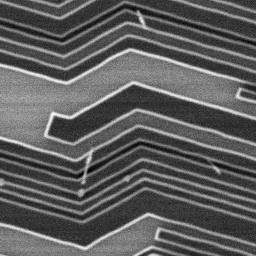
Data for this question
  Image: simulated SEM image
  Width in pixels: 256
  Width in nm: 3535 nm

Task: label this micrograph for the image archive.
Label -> groups of lines, slits or small figures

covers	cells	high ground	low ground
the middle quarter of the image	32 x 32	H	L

LLHHHHHHHLLLLLLLLLLLLLLLLLLLLLLH
HHHHHHHLLLLLLLLLLLLLLLLLLLLLLLLL
HHHHHLLLLLLLLLLLLLLLLLLLLLLLLLLL
HHHLLLLLLLLLLLLLLLLLLLLLLLLLLLLL
HLLLLLLLLLLLLLLLLLLLLLLLLLLLLLLL
LLLLLLLLLLLLLLLLHHHHLLLLLLLLLLLL
LLLLLLLLLLLLLLHHHHHHHHHLLLLLLLLL
LLLLLLLLLLLLHHHHHHHHHHHHHHHLLLLL
LLLLLLLLLLHHHHHHHHHHHHHHHHHHHHLL
LLLLLLLLLHHHHHHHHHHHHHHHHHHHHHHH
LLLLLLLHHHHHHHHHHHHHHHHHHHHHHHHH
LLLLLHHHHHHHHHHHHHHHHHHHHHHHHHHH
LLLHHHHHHHHHHHHHLLLLLLLHHHHHHHHH
HHHHHHHHHHHHHHLLLLLLLLLLLHHHHHHH
HHHHHHHHHHHHHLLLLLLLLLLLLLLLLHHH
HHHHHHHHHHHLLLLLLLLLLLLLLLLLLLLL
HHHHHHHHHLLLLLLLLHHHHHLLLLLLLLLL
HHHHHHHLLLLLLLLHHHHHHHHHHHLLLLLL
HHHHHLLLLLLLLHHHHHHHHHHHHHHHHLLL
HHHLLLLLLLLHHHHHHHLLLHHHHHHHHHHH
LLLLLLLLLHHHHHHHLLLLLLLLLHHHHHHH
LLLLLLLHHHHHHHLLLHHHHHHLLLLLHHHH
LLLLLLHHHHHHLLLHHHHHHHHHHLLLLLLL
HLLLHHHHHHLLLLHHHHHHHHHHHHHHHHLL
HHHHHHHHLLLLHHHHHHHLLLHHHHHHHHHH
HHHHHHHLLLHHHHHHHLLLLLLLLHHHHHHH
LHHHHHLLLHHHHHHLLLLLLLLLLLLLLHHH
LLLLLHHHHHHHHLLLLHHHHHHLLLLLLLLL
LLLLHHHHHHHLLLLHHHHHHHHHHHHLLLLL
HHHHHHHHHLLLLLHHHHHLLLHHHHHHHHHL
HHHHHHHHLLLLHHHHHLLLLLLLLLHHHHHH
HHHHHHLLLLHHHHHLLLLHHHLLLLLLLHHH